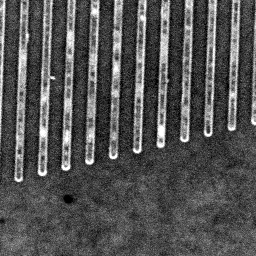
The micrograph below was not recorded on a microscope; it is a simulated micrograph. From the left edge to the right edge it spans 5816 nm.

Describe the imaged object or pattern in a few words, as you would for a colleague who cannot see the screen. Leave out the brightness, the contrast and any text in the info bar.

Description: parallel lines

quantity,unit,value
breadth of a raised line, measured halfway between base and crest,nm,153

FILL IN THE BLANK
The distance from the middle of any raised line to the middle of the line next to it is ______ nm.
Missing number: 534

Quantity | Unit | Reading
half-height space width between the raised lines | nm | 386